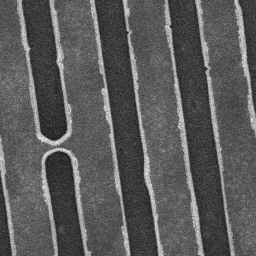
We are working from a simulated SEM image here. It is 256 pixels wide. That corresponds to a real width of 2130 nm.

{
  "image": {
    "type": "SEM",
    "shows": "one or a few lines or trenches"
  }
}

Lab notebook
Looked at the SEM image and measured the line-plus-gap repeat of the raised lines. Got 0.599 micrometres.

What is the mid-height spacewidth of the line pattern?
29.7 pixels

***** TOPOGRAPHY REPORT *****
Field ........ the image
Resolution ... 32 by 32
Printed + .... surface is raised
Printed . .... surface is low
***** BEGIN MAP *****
+++...++++++....+++++....+++++..
+++....+++++....+++++....+++++..
+++....+++++....+++++....+++++..
+++....+++++....+++++....+++++..
+++....+++++....+++++....+++++..
+++....+++++....+++++....+++++..
+++....++++++...+++++.....+++++.
+++....++++++...++++++....+++++.
++++....+++++....+++++....+++++.
++++....+++++....+++++....+++++.
++++....+++++....+++++....+++++.
++++....+++++....+++++....+++++.
++++....+++++....+++++....+++++.
+++++...++++++...++++++....+++++
+++++...++++++...++++++....+++++
+++++....+++++....+++++....+++++
+++++...++++++....+++++....+++++
++++++.+++++++....+++++....+++++
++++++++++++++....+++++....+++++
++++++...+++++....+++++....+++++
+++++....++++++...+++++.....++++
++++++...++++++...++++++....++++
++++++...++++++...++++++....++++
.+++++....+++++....+++++....++++
.+++++....+++++....+++++....++++
.+++++....+++++....+++++....++++
.+++++....+++++....++++++...++++
.++++++...++++++...++++++...++++
.++++++...++++++....+++++....+++
.++++++...++++++....+++++....+++
..+++++....+++++....+++++....+++
..+++++....+++++....+++++....+++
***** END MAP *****